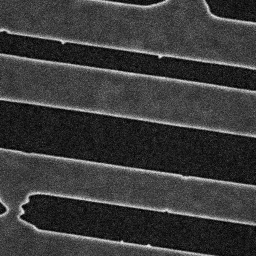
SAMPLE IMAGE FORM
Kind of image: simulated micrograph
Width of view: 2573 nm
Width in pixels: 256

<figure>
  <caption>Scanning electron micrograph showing one or a few lines or trenches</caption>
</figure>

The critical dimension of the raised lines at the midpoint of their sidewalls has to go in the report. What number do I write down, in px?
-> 45.4